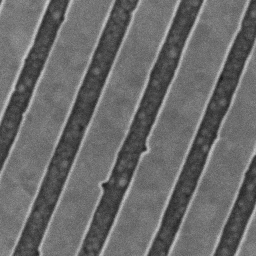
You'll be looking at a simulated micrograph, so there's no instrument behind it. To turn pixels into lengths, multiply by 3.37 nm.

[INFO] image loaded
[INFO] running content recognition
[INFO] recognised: one or a few lines or trenches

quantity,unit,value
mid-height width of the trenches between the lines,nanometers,74.6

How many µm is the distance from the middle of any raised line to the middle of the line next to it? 0.209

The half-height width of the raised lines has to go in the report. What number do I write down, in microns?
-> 0.138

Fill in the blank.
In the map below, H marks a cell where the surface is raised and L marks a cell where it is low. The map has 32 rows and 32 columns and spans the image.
HHHHHHLLLHHHHHLLLHHHHHLLLHHHHHHL
HHHHHHLLHHHHHHLLLHHHHHLLLHHHHHHL
HHHHHLLLHHHHHLLLHHHHHHLLLHHHHHLL
HHHHHLLLHHHHHLLLHHHHHLLLHHHHHHLL
HHHHLLLHHHHHLLLLHHHHHLLLHHHHHLLL
HHHHLLLHHHHHLLLHHHHHLLLHHHHHHLLL
HHHLLLHHHHHHLLLHHHHHLLLHHHHHHLLH
HHHLLLHHHHHLLLHHHHHLLLLHHHHHLLLH
HHHLLHHHHHHLLLHHHHHLLLHHHHHHLLLH
HHLLLHHHHHHLLLHHHHHLLLHHHHHLLLHH
HHLLLHHHHHLLLHHHHHLLLHHHHHHLLLHH
HLLLHHHHHHLLLHHHHHLLLHHHHHHLLHHH
HLLLHHHHHLLLHHHHHHLLLHHHHHLLLHHH
HLLLHHHHHLLLHHHHHLLLHHHHHHLLLHHH
LLLHHHHHHLLLHHHHHLLLHHHHHLLLHHHH
LLLHHHHHLLLHHHHHLLLHHHHHHLLLHHHH
LLHHHHHHLLLHHHHHLLLHHHHHLLLHHHHH
LLHHHHHLLLHHHHHHLLHHHHHHLLLHHHHH
LHHHHHHLLLHHHHHLLLHHHHHHLLHHHHHH
LHHHHHHLLLHHHHHLLLHHHHHLLLHHHHHH
LHHHHHLLLHHHHHLLLHHHHHHLLLHHHHHL
HHHHHHLLLHHHHHLLLHHHHHLLLHHHHHHL
HHHHHLLLHHHHHLLLHHHHHHLLLHHHHHLL
HHHHHLLLHHHHHLLLHHHHHHLLLHHHHHLL
HHHHHLLLHHHHHLLLHHHHHLLLHHHHHHLL
HHHHLLLHHHHHLLLHHHHHHLLLHHHHHLLL
HHHHLLLHHHHHLLLHHHHHLLLHHHHHHLLL
HHHLLLHHHHHLLLHHHHHHLLLHHHHHLLLH
HHHLLLHHHHHLLLHHHHHHLLLHHHHHLLLH
HHLLLHHHHHHLLLHHHHHLLLHHHHHHLLHH
HHLLLHHHHHLLLHHHHHHLLLHHHHHLLLHH
HHLLLHHHHHLLLHHHHHLLLHHHHHHLLLHH